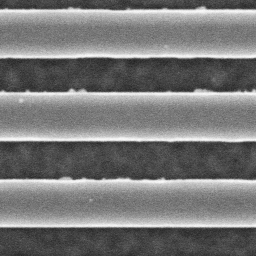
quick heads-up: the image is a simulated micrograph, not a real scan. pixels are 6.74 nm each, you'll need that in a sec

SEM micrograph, lines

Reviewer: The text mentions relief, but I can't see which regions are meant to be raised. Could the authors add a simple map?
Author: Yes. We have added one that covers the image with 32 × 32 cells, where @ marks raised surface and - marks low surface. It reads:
--------------------------------
@@@@@@@@@@@@@@@@@@@@@@@@@@@@@@@@
@@@@@@@@@@@@@@@@@@@@@@@@@@@@@@@@
@@@@@@@@@@@@@@@@@@@@@@@@@@@@@@@@
@@@@@@@@@@@@@@@@@@@@@@@@@@@@@@@@
@@@@@@@@@@@@@@@@@@@@@@@@@@@@@@@@
@@@@@@@@@@@@@@@@@@@@@@@@@@@@@@@@
--------------------------------
--------------------------------
--------------------------------
--------------------------------
--------------------------------
@@@@@@@@@@@@@@@@@@@@@@@@@@@@@@@@
@@@@@@@@@@@@@@@@@@@@@@@@@@@@@@@@
@@@@@@@@@@@@@@@@@@@@@@@@@@@@@@@@
@@@@@@@@@@@@@@@@@@@@@@@@@@@@@@@@
@@@@@@@@@@@@@@@@@@@@@@@@@@@@@@@@
@@@@@@@@@@@@@@@@@@@@@@@@@@@@@@@@
--------------------------------
--------------------------------
--------------------------------
--------------------------------
--------------------------------
@@@@@@@@@@@@@@@@@@@@@@@@@@@@@@@@
@@@@@@@@@@@@@@@@@@@@@@@@@@@@@@@@
@@@@@@@@@@@@@@@@@@@@@@@@@@@@@@@@
@@@@@@@@@@@@@@@@@@@@@@@@@@@@@@@@
@@@@@@@@@@@@@@@@@@@@@@@@@@@@@@@@
--------------------------------
--------------------------------
--------------------------------
--------------------------------